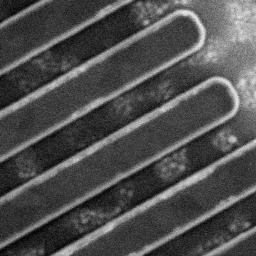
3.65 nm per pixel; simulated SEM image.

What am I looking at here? one or a few lines or trenches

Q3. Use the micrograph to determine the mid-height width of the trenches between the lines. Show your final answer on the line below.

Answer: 124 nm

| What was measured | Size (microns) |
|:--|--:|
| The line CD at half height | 0.152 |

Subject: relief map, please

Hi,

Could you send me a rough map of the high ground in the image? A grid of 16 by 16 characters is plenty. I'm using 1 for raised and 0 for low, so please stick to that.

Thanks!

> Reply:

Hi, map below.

0011111000000000
1111100000110000
1111000011111000
1100001111100000
0000011111000000
0001111100001100
0111110000011110
1111000001111100
1110000111110000
1000011111000001
0001111110000111
0011111000011111
1111100000111110
1110000011111000
1100001111100000
0000111110000011